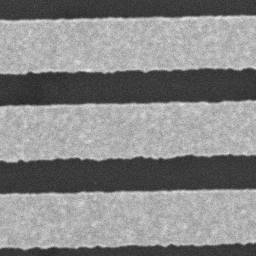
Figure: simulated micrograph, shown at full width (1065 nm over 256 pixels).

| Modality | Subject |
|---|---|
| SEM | lines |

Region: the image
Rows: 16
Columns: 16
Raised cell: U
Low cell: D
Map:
DDDDDDDDDDDDDDDD
UUUUUUUUUUUUUUUU
UUUUUUUUUUUUUUUU
UUUUUUUUUUUUUUUU
UUUDDDUDDDDDDDDD
DDDDDDDDDDDDDDDD
DDDDDDDDUUUUUUUU
UUUUUUUUUUUUUUUU
UUUUUUUUUUUUUUUU
UUUUUUUUUUUUUUUU
DDDDDDDDDDDDDDDD
DDDDDDDDDDDDDDDD
UUUUUUUUUUUUUUUU
UUUUUUUUUUUUUUUU
UUUUUUUUUUUUUUUU
DUUDDDDDDDDDDDDD